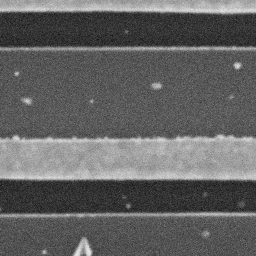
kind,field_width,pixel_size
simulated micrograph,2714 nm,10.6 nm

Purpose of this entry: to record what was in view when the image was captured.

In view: lines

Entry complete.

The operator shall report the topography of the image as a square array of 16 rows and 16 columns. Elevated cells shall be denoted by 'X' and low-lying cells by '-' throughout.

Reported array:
XXXXXXXXXXXXXXXX
----------------
----------------
XXXXXXXXXXXXXXXX
XXXXXXXXXXXXXXXX
XXXXXXXXXXXXXXXX
XXXXXXXXXXXXXXXX
XXXXXXXXXXXXXXXX
XXXXXXXXXXXXXXXX
XXXXXXXXXXXXXXXX
XXXXXXXXXXXXXXXX
----------------
----------------
XXXXXXXXXXXXXXXX
XXXXXXXXXXXXXXXX
XXXXXXXXXXXXXXXX